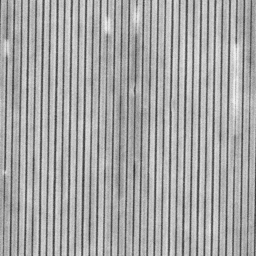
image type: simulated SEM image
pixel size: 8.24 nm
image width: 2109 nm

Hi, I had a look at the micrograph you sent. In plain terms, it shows parallel lines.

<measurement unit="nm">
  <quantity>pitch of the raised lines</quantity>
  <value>59.1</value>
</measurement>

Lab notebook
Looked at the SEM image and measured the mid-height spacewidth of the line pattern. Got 14.4 nm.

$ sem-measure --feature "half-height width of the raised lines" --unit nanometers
42.2